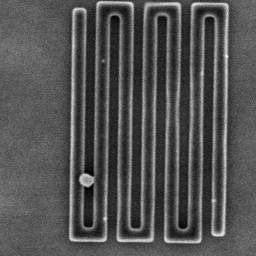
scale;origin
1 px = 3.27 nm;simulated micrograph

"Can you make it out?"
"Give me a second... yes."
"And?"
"groups of lines, slits or small figures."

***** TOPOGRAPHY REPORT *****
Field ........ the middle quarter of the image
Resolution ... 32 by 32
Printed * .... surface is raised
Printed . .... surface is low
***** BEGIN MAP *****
..***...***...***...***...***...
..***...***...***...***...***...
..***...***...***...***...***...
..***...***...***...***...***...
..***...***...***...***...***...
..***...***...***...***...***...
..***...***...***...***...***...
..***...***...***...***...***...
..***...***...***...***...***...
..***...***...***...***...***...
..***...***...***...***...**....
..***...***...***...***...**....
..***...***...***...***...**....
..***...***...***...***...**....
..***...***...***...***...**....
..***...***...***...***...**....
..***...***...***...***...**....
..***...***...***...***...***...
..***...***...***...***...***...
..***...***...***...***...***...
..***...***...***...***...***...
..***...***...***...***...***...
..***...***...***...***...***..*
..***...***...***...**....***..*
..***...***...***...**....***..*
..***...***...***...**...****..*
..***...***...***...**...****..*
..***...***...***...**...****..*
..*********...***...**...****..*
..*********...**....**...****..*
..*****.***...**...***...****..*
..***...***...**...***...***...*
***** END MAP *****